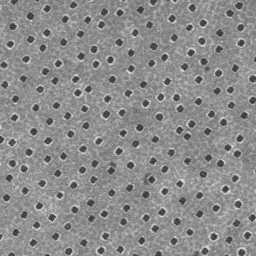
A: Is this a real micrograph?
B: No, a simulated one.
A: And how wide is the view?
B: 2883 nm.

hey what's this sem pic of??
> a regular array of holes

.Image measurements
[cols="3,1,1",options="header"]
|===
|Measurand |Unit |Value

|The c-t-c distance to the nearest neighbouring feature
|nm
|183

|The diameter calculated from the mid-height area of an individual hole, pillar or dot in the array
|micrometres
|0.0857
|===